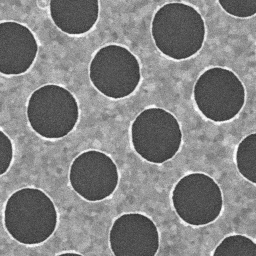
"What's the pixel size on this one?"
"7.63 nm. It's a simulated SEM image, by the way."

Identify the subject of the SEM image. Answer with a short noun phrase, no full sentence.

a regular array of holes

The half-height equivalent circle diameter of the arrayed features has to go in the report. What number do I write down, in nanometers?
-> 406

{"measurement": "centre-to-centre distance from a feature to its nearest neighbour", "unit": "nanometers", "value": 570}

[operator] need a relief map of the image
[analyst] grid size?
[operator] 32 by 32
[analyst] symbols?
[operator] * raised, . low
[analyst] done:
*****.......*********..****.....
******......********.....***....
*******.....*******......*******
...****....********.......******
....***************.......******
.....**************......*******
.....*******....****.....*******
....*******......***************
....*******......*********..****
***********.......*******.....**
************.....*******......**
****.....***.....*******.......*
****.....***************.......*
***.......*********.*****.....**
***.......*******.....****...***
****.....********.....**********
****.....*******.......*********
.***************.......*******..
..***************.....********..
..********....****....*******...
.********.....****************..
.********......***************..
*********......*******.....****.
***.*****......*******.....*****
*.....****....********......****
*......***************......****
*......***************......****
*......*******.....****....*****
*......*******......************
*.....********......*********.**
***..*********......*******.....
**************......*******.....